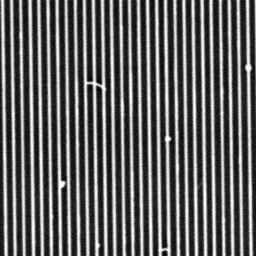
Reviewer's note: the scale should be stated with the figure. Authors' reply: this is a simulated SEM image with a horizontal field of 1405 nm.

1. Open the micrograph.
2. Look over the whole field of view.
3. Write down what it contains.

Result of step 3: parallel lines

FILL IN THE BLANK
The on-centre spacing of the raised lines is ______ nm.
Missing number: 49.8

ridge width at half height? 14.4 nm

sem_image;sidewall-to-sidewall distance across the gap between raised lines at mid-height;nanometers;37.7